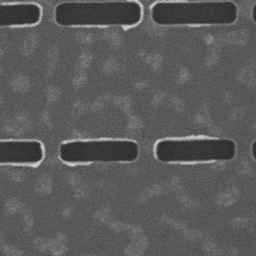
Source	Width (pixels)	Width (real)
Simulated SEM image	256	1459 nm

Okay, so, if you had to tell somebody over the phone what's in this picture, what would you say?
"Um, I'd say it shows holes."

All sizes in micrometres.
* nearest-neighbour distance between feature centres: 0.549